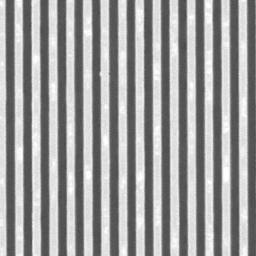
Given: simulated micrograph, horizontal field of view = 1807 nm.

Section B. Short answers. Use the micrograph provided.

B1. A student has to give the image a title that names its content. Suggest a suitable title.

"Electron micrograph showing parallel lines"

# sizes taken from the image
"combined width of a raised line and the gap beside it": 122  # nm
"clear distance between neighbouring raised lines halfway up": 61.8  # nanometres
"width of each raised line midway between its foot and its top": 61.8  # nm